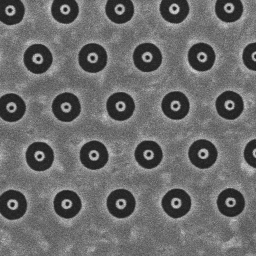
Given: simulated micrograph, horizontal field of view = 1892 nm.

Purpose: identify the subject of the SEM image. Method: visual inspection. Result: a regular array of ring-shaped grooves with a dot in the middle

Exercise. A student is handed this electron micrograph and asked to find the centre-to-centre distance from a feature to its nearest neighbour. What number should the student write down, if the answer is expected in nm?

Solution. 400